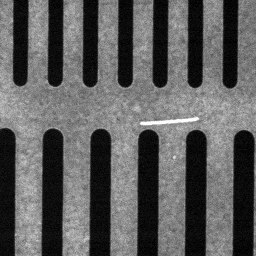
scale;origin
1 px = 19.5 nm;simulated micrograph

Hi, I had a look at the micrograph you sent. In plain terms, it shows groups of lines, slits or small figures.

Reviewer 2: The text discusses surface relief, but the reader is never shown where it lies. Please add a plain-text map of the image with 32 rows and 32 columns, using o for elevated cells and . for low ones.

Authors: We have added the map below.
oo..oo..oo..ooo..oo..oo...oo..oo
oo..oo..oo..ooo..oo..oo...oo..oo
oo..oo..oo..ooo..oo..oo...oo..oo
oo..oo..oo..ooo..oo..oo...oo..oo
oo..oo..oo..ooo..oo..oo...oo..oo
oo..oo..oo..ooo..oo..oo...oo..oo
oo..oo..oo..ooo..oo..oo...oo..oo
oo..oo..oo..ooo..oo..oo..ooo..oo
oo..oo..oo..ooo..oo..oo..ooo..oo
oo..oo..oo..ooo..oo..oo..ooo..oo
oo.ooo..ooo.ooo.ooo..ooo.ooo..oo
oooooooooooooooooooooooooooooooo
oooooooooooooooooooooooooooooooo
oooooooooooooooooooooooooooooooo
oooooooooooooooooooooooooooooooo
oooooooooooooooooooooooooooooooo
..oooo..oooo..oooo.ooooo.ooooo.o
..ooo...ooo...ooo...ooo...ooo...
..ooo...ooo...ooo...ooo...ooo...
..ooo...ooo...ooo...ooo...ooo...
..ooo...ooo...ooo...ooo...ooo...
..ooo...ooo...ooo...ooo...ooo...
..ooo...ooo...ooo...ooo...ooo...
..ooo...ooo...ooo...ooo...ooo...
..ooo...ooo...ooo...ooo...ooo...
..ooo...ooo...ooo...ooo...ooo...
..ooo...ooo...ooo...ooo...ooo...
..ooo...ooo...ooo...ooo...ooo...
..ooo...ooo...ooo...ooo...ooo...
..ooo...ooo...ooo...ooo...ooo...
..ooo...ooo...ooo...ooo...ooo...
..ooo...ooo...ooo...ooo...ooo...